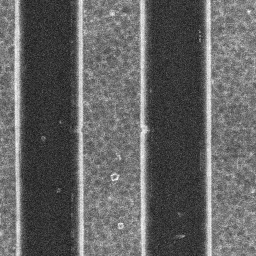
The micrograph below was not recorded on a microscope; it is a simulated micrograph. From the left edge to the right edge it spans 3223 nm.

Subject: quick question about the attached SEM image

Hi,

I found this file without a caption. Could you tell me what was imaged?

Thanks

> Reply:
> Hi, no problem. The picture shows one or a few lines or trenches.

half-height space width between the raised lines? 812 nm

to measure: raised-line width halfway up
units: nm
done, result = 787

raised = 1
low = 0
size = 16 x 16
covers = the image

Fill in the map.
1000011110000111
1000011110000111
1000011110000111
1000011110000111
1000011110000111
1000011110000111
1000011110000111
1000011110000111
1000011110000111
1000011110000111
1000011110000111
1000011110000111
1000011110000111
1000011110000111
1000011110000111
1000011110000111